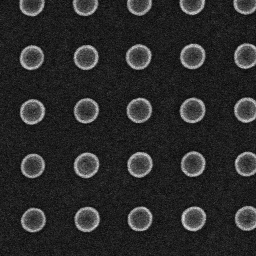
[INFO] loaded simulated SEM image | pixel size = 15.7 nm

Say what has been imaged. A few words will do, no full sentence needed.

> a regular array of raised bodies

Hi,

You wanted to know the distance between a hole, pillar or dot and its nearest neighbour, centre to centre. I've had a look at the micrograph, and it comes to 0.836 micrometres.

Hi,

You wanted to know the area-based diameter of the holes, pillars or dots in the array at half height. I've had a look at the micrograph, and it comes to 358 nanometers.